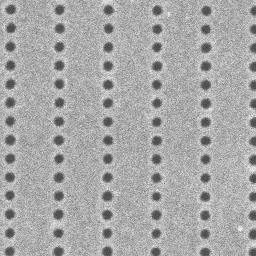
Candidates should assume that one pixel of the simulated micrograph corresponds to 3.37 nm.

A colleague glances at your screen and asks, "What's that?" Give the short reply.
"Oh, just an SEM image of a regular array of holes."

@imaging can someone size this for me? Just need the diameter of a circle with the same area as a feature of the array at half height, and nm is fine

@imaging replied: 34.2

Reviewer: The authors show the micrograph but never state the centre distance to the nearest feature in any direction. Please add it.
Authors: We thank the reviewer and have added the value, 62.2 nanometres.